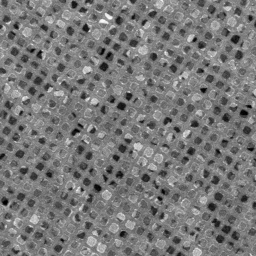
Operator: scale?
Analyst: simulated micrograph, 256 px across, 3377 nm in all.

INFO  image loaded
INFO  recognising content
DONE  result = a regular array of raised bodies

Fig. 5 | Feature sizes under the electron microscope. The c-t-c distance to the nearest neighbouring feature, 0.153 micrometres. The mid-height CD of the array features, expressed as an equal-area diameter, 114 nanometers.